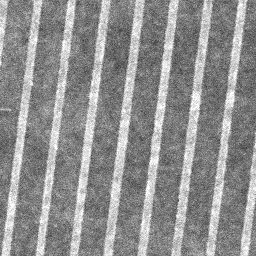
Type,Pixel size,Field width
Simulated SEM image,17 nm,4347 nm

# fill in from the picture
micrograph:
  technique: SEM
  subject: parallel lines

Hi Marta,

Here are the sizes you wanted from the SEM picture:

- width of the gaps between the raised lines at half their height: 26.5 px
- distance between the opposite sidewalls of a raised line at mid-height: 7.19 px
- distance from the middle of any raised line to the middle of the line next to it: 574 nm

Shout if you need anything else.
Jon